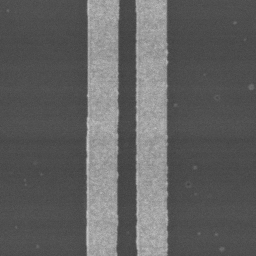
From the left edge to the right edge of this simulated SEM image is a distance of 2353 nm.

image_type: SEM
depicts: lines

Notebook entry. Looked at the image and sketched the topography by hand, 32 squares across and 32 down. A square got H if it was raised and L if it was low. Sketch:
LLLLLLLLLLLHHHHLLHHHHLLLLLLLLLLL
LLLLLLLLLLLHHHHLLHHHHLLLLLLLLLLL
LLLLLLLLLLLHHHHLLHHHHLLLLLLLLLLL
LLLLLLLLLLLHHHHLLHHHHLLLLLLLLLLL
LLLLLLLLLLLHHHHLLHHHHLLLLLLLLLLL
LLLLLLLLLLLHHHHLLHHHHLLLLLLLLLLL
LLLLLLLLLLLHHHHLLHHHHLLLLLLLLLLL
LLLLLLLLLLLHHHHLLHHHHLLLLLLLLLLL
LLLLLLLLLLLHHHHLLHHHHLLLLLLLLLLL
LLLLLLLLLLLHHHHLLHHHHLLLLLLLLLLL
LLLLLLLLLLLHHHHLLHHHHLLLLLLLLLLL
LLLLLLLLLLLHHHHLLHHHHLLLLLLLLLLL
LLLLLLLLLLLHHHHLLHHHHLLLLLLLLLLL
LLLLLLLLLLLHHHHLLHHHHLLLLLLLLLLL
LLLLLLLLLLLHHHHLLHHHHLLLLLLLLLLL
LLLLLLLLLLLHHHHLLHHHHLLLLLLLLLLL
LLLLLLLLLLLHHHHLLHHHHLLLLLLLLLLL
LLLLLLLLLLLHHHHLLHHHHLLLLLLLLLLL
LLLLLLLLLLLHHHHLLHHHHLLLLLLLLLLL
LLLLLLLLLLLHHHHLLHHHHLLLLLLLLLLL
LLLLLLLLLLLHHHHLLHHHHLLLLLLLLLLL
LLLLLLLLLLLHHHHLLHHHHLLLLLLLLLLL
LLLLLLLLLLLHHHHLLHHHHLLLLLLLLLLL
LLLLLLLLLLLHHHHLLHHHHLLLLLLLLLLL
LLLLLLLLLLLHHHHLLHHHHLLLLLLLLLLL
LLLLLLLLLLLHHHHLLHHHHLLLLLLLLLLL
LLLLLLLLLLLHHHHLLHHHHLLLLLLLLLLL
LLLLLLLLLLLHHHHLLHHHHLLLLLLLLLLL
LLLLLLLLLLLHHHHLLHHHHLLLLLLLLLLL
LLLLLLLLLLLHHHHLLHHHHLLLLLLLLLLL
LLLLLLLLLLLHHHHLLHHHHLLLLLLLLLLL
LLLLLLLLLLLHHHHLLHHHHLLLLLLLLLLL